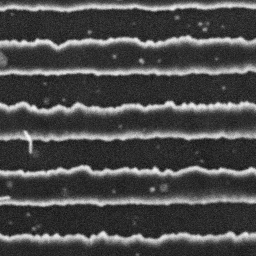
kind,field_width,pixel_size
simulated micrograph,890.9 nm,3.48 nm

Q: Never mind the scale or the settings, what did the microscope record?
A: lines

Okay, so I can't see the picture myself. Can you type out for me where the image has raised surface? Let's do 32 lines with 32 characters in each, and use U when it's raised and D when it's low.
UUUUUUUUUUUUUUUUUUUUUUUUUUUUUUUU
DDDDDDDDDDDDDDDDDDDDDDDDDDDDDDDD
DDDDDDDDDDDDDDDDDDDDDDDDDDDDDDDD
DDDDDDDDDDDDDDDDDDDDDDDDDDDDDDDD
DDDDDDDDDDDDDDDDDDDDDDDDDDDDDDDD
UUUUUUUDUUUUUUUUUUUUUUUUUUUUUUUU
UUUUUUUUUUUUUUUUUUUUUUUUUUUUUUUU
UUUUUUUUUUUUUUUUUUUUUUUUUUUUUUUU
UUUUUUUUUUUUUUUUUUUUUUUUUUUUUUUU
DDDDDDDDDDDDDDDDDDDDDDDDDDDDDDDD
DDDDDDDDDDDDDDDDDDDDDDDDDDDDDDDD
DDDDDDDDDDDDDDDDDDDDDDDDDDDDDDDD
DDDDDDDDDDDDDDDDDDDDDDDDDDDDDDDD
UUUUDDDUDUUDDDDUUUUUUUUUUUUUUUUU
UUUUUUUUUUUUUUUUUUUUUUUUUUUUUUUU
UUUUUUUUUUUUUUUUUUUUUUUUUUUUUUUU
UUUUUUUUUUUUUUUUUUUUUUUUUUUUUUUU
DDDUDDDDDDDDDDDDDDDDDDDDDDDDDDDD
DDDDDDDDDDDDDDDDDDDDDDDDDDDDDDDD
DDDDDDDDDDDDDDDDDDDDDDDDDDDDDDDD
DDDDDDDDDDDDDDDDDDDDDDDDDDDDDDDD
UDUDDDUUUUUUUUUUUUUUUUUUUUUUUUUU
UUUUUUUUUUUUUUUUUUUUUUUUUUUUUUUU
UUUUUUUUUUUUUUUUUUUUUUUUUUUUUUUU
UUUUUUUUUUUUUUUUUUUUUUUUUUUUUUUU
DDDDUUDDDDDDUDDDDDDDDDDDDDDDDDDD
DDDDDDDDDDDDDDDDDDDDDDDDDDDDDDDD
DDDDDDDDDDDDDDDDDDDDDDDDDDDDDDDD
DDDDDDDDDDDDDDDDDDDDDDDDDDDDDDDD
DDDUDDDDDDDDUDDDDDDDDUUUDDDDUDUU
UUUUUUUUUUUUUUUUUUUUUUUUUUUUUUUU
UUUUUUUUUUUUUUUUUUUUUUUUUUUUUUUU